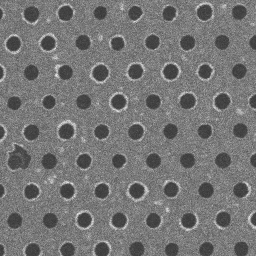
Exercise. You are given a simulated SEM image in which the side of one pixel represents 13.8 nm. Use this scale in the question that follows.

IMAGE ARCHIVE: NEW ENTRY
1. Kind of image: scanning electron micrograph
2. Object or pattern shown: a regular array of holes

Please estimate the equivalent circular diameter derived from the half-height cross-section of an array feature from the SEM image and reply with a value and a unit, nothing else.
0.208 µm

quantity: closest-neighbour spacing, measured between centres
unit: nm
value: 465